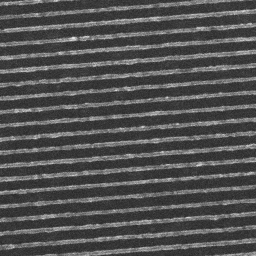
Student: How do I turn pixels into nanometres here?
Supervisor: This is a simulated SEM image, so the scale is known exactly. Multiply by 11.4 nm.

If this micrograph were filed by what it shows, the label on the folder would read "parallel lines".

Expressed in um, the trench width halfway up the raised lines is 0.119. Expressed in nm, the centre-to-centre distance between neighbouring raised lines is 153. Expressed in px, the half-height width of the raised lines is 2.99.